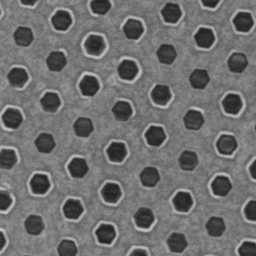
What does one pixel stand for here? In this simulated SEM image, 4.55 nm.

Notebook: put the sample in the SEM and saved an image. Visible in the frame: a regular array of holes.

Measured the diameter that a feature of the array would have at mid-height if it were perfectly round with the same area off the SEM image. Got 95.7 nanometers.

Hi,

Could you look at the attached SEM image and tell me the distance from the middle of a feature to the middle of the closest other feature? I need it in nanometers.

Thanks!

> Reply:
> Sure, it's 187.